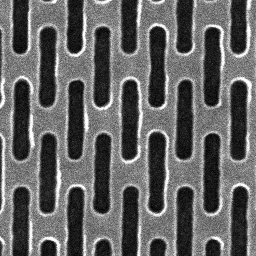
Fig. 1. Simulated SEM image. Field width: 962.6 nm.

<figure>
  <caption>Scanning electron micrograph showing a regular array of holes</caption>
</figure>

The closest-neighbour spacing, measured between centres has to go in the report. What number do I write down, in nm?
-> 204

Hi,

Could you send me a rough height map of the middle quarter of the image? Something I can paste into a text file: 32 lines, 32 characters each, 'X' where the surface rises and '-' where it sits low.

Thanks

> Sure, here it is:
XXXXXXXX---XXXXXXXXXXX---XXXXXXX
XXXXXXXX----XXXXXXXXXX---XXXXXXX
XXXXXXXX----XXXXXXXXXX---XXXXXXX
XXXXXXXX----XXXXXXXXX----XXXXXXX
XX---XXX----XXX---XXX----XXXX---
X----XX-----XXX---XXX----XXXX---
X----XX-----XXX---XXX----XXXX---
X----XX-----XXX----XX----XXX----
X----XX----XXXX----XX----XXX----
X----XXX---XXXX----XX----XXX----
X----XXX--XXXX-----XXX--XXXX----
X----XXXXXXXXX-----XXXXXXXXX----
X----XXXXXXXXX-----XXXXXXXXX----
X----XXXXXXXXX-----XXXXXXXXX----
X----XXXXXXXXXX---XXXXXXXXXX----
X----XXXXXXXXXX---XXXXXXXXXX----
X----XXXXXXXXXX---XXXXXXXXXX----
X----XXXX--XXX----XXXX---XXX----
X----XXX----XX----XXX----XXX----
X----XXX----XX----XXX----XXX----
X----XXX----XX----XXX----XXX----
X----XXX----XX----XXX----XXX----
X----XXX----XX----XXX----XXX----
X---XXXX----XXX---XXX----XXXX--X
XXXXXXXX----XXXXXXXXX----XXXXXXX
XXXXXXXX---XXXXXXXXXX----XXXXXXX
XXXXXXXX---XXXXXXXXXX----XXXXXXX
XXXXXXXX---XXXXXXXXXX----XXXXXXX
XXXXXXXX---XXXXXXXXXX----XXXXXXX
XXXXXXXX---XXXXXXXXXX----XXXXXXX
XXXXXXXX---XXXXX-XXXX----XXXXXXX
X----XXX---XXXX---XXX----XXXX---